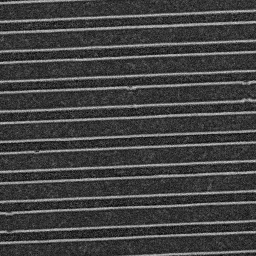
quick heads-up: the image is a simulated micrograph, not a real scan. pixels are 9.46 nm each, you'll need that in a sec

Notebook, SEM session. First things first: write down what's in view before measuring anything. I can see parallel lines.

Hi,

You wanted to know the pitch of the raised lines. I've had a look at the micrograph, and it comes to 30 pixels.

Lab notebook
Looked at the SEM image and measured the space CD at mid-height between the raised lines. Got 104 nanometers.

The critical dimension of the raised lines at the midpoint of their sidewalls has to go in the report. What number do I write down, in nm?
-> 180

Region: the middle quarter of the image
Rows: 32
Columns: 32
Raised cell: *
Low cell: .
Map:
********************************
********************************
**************************......
***.............................
................................
.........................*******
..******************************
********************************
********************************
********************************
**************..**..............
................................
................................
...................*************
********************************
********************************
********************************
**************************......
********........................
................................
...............................*
........************************
********************************
********************************
********************************
***************.................
................................
................................
....................************
********************************
********************************
********************************